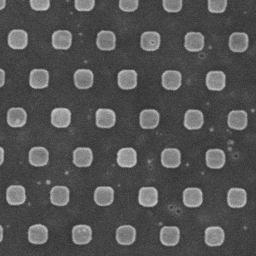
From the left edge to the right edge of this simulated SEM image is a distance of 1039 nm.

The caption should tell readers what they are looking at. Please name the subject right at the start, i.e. a regular array of raised bodies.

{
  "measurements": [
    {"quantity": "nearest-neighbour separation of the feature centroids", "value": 179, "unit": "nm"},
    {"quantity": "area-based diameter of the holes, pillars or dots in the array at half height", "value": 81.7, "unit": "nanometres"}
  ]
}